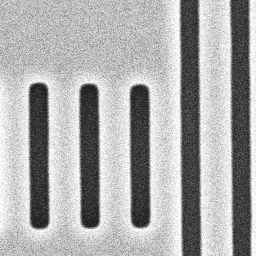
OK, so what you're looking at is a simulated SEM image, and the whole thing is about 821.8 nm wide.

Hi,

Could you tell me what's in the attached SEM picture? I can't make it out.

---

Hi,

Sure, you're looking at groups of lines, slits or small figures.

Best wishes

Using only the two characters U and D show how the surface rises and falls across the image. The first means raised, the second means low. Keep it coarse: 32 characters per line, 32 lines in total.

UUUUUUUUUUUUUUUUUUUUUUDDDUUUUDDU
UUUUUUUUUUUUUUUUUUUUUUDDDUUUUDDU
UUUUUUUUUUUUUUUUUUUUUUDDDUUUUDDU
UUUUUUUUUUUUUUUUUUUUUUDDDUUUUDDU
UUUUUUUUUUUUUUUUUUUUUUDDDUUUUDDU
UUUUUUUUUUUUUUUUUUUUUUDDDUUUUDDU
UUUUUUUUUUUUUUUUUUUUUUUDDUUUUDDU
UUUUUUUUUUUUUUUUUUUUUUUDDUUUUDDU
UUUUUUUUUUUUUUUUUUUUUUUDDUUUUDDU
UUUUUUUUUUUUUUUUUUUUUUUDDUUUUDDU
UUUUDUUUUUUDUUUUUDUUUUUDDUUUUDDU
UUUUDDUUUUDDUUUUDDDUUUDDDUUUUDDU
UUUUDDUUUUDDUUUUDDDUUUDDDUUUUDDU
UUUUDDUUUUDDUUUUDDDUUUUDDUUUUDDU
UUUUDDUUUUDDUUUUDDDUUUUDDUUUUDDU
UUUUDDUUUUDDUUUUDDDUUUUDDUUUUDDU
UUUUDDUUUUDDUUUUDDDUUUUDDUUUUDDU
UUUUDDUUUUDDUUUUDDDUUUUDDUUUUDDU
UUUUDDUUUUDDUUUUDDDUUUUDDUUUUDDU
UUUUDDUUUUDDUUUUDDDUUUUDDUUUUDDU
UUUUDDUUUUDDUUUUDDDUUUUDDUUUUDDU
UUUUDDUUUUDDUUUUDDDUUUUDDUUUUDDU
UUUUDDUUUUDDUUUUDDDUUUUDDUUUUDDU
UUUUDDUUUUDDUUUUDDDUUUUDDUUUUDDU
UUUUDDUUUUDDUUUUDDDUUUUDDUUUUDDU
UUUUDDUUUUDDUUUUDDDUUUUDDUUUUDDU
UUUUDDUUUUDDUUUUDDDUUUUDDUUUUDDU
UUUUDDUUUUDDUUUUDDDUUUUDDUUUUDDU
UUUUDUUUUUUDUUUUUUUUUUUDDUUUUDDU
UUUUUUUUUUUUUUUUUUUUUUUDDUUUUDDU
UUUUUUUUUUUUUUUUUUUUUUUDDUUUUDDU
UUUUUUUUUUUUUUUUUUUUUUUDDUUUUDDU